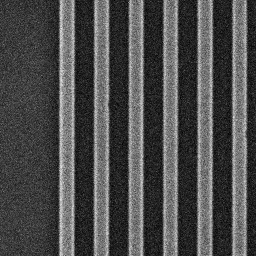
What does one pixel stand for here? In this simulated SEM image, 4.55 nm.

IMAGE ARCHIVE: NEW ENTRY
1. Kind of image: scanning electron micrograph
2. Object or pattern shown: parallel lines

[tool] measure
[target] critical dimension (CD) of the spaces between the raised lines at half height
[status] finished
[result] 97.9 nanometres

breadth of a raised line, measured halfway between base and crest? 58.6 nanometers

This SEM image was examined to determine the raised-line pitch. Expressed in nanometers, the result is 158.